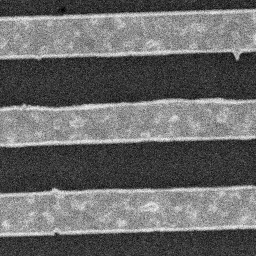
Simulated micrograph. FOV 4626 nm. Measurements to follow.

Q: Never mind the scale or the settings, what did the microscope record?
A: one or a few lines or trenches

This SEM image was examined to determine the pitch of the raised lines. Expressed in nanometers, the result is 1590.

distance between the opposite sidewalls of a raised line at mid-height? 682 nm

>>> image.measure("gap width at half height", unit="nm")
928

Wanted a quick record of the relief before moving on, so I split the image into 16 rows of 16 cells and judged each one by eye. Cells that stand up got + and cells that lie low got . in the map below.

................
++++++++++++++++
++++++++++++++++
+++.............
................
................
.........+++++++
++++++++++++++++
++++++++++++++++
................
................
................
++++++++++++++++
++++++++++++++++
++++............
................